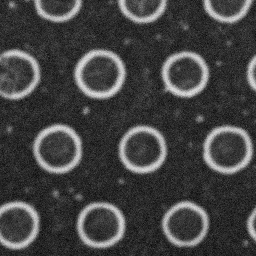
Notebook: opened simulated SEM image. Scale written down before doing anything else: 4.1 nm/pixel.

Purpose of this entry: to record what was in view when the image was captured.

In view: a regular array of raised bodies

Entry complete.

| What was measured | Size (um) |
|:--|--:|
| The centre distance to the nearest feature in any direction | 0.347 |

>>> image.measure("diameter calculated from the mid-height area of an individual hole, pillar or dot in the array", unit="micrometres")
0.172